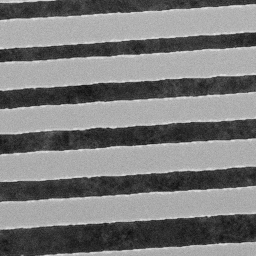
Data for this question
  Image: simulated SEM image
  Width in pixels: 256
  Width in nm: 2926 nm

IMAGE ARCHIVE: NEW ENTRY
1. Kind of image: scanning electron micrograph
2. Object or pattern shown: lines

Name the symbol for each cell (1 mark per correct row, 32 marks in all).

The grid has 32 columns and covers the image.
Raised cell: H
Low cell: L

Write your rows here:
LLLLLLLLLLLLLLLLLLLLLLLLLLLLLLLL
LLLLLLLLLLLLLLLLLLHHHHHHHHHHHHHH
LHHHHHHHHHHHHHHHHHHHHHHHHHHHHHHH
HHHHHHHHHHHHHHHHHHHHHHHHHHHHHHHH
HHHHHHHHHHHHHHHHHHHHHHHHLLLLLLLL
HHHHHHHHHHLLLLLLLLLLLLLLLLLLLLLL
LLLLLLLLLLLLLLLLLLLLLLHHHHHHHHHH
LLLLLLLHHHHHHHHHHHHHHHHHHHHHHHHH
HHHHHHHHHHHHHHHHHHHHHHHHHHHHHHHH
HHHHHHHHHHHHHHHHHHHHHHHHHHHLLLLL
HHHHHHHHHHLLLLLLLLLLLLLLLLLLLLLL
LLLLLLLLLLLLLLLLLLLLLLLLLLLLLLLL
LLLLLLLLLLLLLLLLLLHHHHHHHHHHHHHH
LLHHHHHHHHHHHHHHHHHHHHHHHHHHHHHH
HHHHHHHHHHHHHHHHHHHHHHHHHHHHHHHH
HHHHHHHHHHHHHHHHHHHHLLLLLLLLLLLL
HHHHLLLLLLLLLLLLLLLLLLLLLLLLLLLL
LLLLLLLLLLLLLLLLLLLLLLLLLLLLLLLH
LLLLLLLLLLLLLHHHHHHHHHHHHHHHHHHH
HHHHHHHHHHHHHHHHHHHHHHHHHHHHHHHH
HHHHHHHHHHHHHHHHHHHHHHHHHHHHHHHH
HHHHHHHHHHHHHHHHHHHHHLLLLLLLLLLL
HHHHHHLLLLLLLLLLLLLLLLLLLLLLLLLL
LLLLLLLLLLLLLLLLLLLLLLLLLLLLLHHH
LLLLLLLLLLLLLLHHHHHHHHHHHHHHHHHH
HHHHHHHHHHHHHHHHHHHHHHHHHHHHHHHH
HHHHHHHHHHHHHHHHHHHHHHHHHHHHHHHH
HHHHHHHHHHHHHHHHHHHLLLLLLLLLLLLL
HHLLLLLLLLLLLLLLLLLLLLLLLLLLLLLL
LLLLLLLLLLLLLLLLLLLLLLLLLLLLLLLL
LLLLLLLLLLLLLLLLLLLLLLLLLLLHHHHH
LLLLLLLLLLLLLHHHHHHHHHHHHHHHHHHH